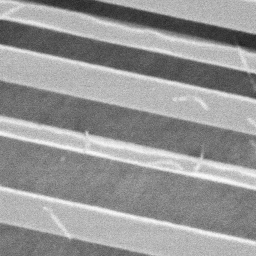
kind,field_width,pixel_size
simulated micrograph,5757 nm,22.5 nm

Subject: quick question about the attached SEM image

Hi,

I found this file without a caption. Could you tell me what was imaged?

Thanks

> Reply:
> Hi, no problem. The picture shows lines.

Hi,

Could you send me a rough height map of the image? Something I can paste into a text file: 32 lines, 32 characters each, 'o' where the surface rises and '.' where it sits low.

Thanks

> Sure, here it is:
oooo..........oooooooooooooooooo
ooooooooo..........ooooooooooooo
.oooooooooooo...........oooooooo
......oooooooooooo..........oooo
..........oooooooooooo..........
...............oooooooooooo.....
oooo................oooooooooooo
ooooooooo...............oooooooo
oooooooooooooo...............ooo
oooooooooooooooooo..............
..ooooooooooooooooooooo.........
.......ooooooooooooooooooooo....
............oooooooooooooooooooo
................oooooooooooooooo
.....................ooooooooooo
oooo......................oooooo
ooooooooo......................o
...ooooooooo....................
........ooooooooo...............
.............ooooooooo..........
.................oooooooooo.....
......................ooooooooo.
...........................ooooo
o..............................o
ooooo...........................
oooooooooo......................
oooooooooooooo..................
ooooooooooooooooooo.............
...ooooooooooooooooooooo........
........ooooooooooooooooooooo...
.............ooooooooooooooooooo
.................ooooooooooooooo